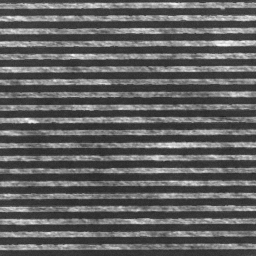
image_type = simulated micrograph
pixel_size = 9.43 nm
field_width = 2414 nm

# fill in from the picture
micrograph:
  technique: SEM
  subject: parallel lines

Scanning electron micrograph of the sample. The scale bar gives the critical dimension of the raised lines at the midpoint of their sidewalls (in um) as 0.0377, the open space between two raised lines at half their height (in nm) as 82.5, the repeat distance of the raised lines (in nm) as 120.